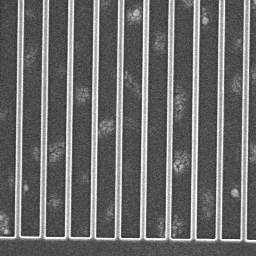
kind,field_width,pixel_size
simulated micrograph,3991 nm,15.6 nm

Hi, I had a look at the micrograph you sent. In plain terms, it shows parallel lines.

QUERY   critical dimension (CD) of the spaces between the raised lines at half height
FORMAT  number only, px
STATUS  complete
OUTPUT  19.2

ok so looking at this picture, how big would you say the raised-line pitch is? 391 nm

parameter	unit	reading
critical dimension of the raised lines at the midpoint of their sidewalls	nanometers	81.9